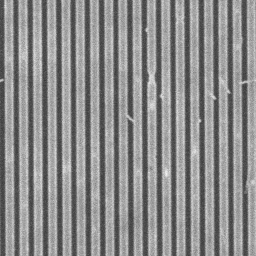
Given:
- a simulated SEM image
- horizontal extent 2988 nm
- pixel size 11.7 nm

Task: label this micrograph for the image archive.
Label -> parallel lines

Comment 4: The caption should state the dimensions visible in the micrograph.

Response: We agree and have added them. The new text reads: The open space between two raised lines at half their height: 78.8 nanometres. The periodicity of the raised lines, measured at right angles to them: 166 nm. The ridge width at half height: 90.4 nm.